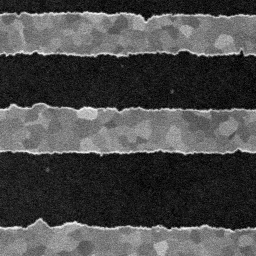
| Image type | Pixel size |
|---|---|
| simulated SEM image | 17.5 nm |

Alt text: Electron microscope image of one or a few lines or trenches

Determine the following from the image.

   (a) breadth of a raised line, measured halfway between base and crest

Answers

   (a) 736 nm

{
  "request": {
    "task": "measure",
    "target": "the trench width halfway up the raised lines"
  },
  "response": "1100 nm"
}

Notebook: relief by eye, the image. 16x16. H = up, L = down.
LLLLLLLLLLLLLLLL
HHHHHHHHHHHHHHHH
HHHHHHHHHHHHHHHH
LLLLLLLLLLLLLLLL
LLLLLLLLLLLLLLLL
LLLLLLLLLLLLLLLL
LLLLLLLLLLLLLLLL
HHHHHHHHHHHHHHHH
HHHHHHHHHHHHHHHH
LLHHLHHHHLLHHHLL
LLLLLLLLLLLLLLLL
LLLLLLLLLLLLLLLL
LLLLLLLLLLLLLLLL
LLLLLLLLLLLLLLLL
HHHHHHHHHHHHHHHH
HHHHHHHHHHHHHHHH